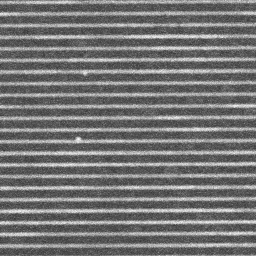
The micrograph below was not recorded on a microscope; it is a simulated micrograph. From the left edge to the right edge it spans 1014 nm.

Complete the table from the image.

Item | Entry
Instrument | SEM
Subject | parallel lines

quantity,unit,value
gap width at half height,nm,35.6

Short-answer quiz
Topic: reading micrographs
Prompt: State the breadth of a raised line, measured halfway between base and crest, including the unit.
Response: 9.4 nm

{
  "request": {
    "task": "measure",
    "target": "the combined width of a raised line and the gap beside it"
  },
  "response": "45.9 nm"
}